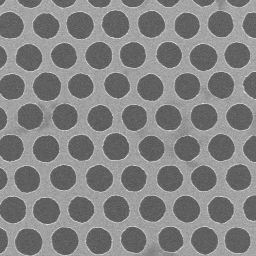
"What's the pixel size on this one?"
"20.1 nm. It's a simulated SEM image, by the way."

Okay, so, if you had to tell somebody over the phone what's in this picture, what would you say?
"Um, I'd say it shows a regular array of holes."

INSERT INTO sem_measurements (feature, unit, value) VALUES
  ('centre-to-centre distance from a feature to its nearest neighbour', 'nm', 687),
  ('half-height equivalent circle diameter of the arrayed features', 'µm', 0.536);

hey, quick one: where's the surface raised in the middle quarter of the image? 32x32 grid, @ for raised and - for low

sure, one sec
--@@@@-----@@@@----@@@@@@---@@@@
@@@@@@@@@@@@@@@@@@@@@@@@@@@@@@@@
@@@--@@@@@@----@@@@@@-@@@@@@@---
@@-----@@@------@@@-----@@@@----
@------@@@------@@-------@@@----
@-------@@-------@-------@@-----
@------@@@------@@-------@@@----
@@-----@@@@-----@@@------@@@----
@@@--@@@@@@@@-@@@@@-----@@@@@---
@@@@@@@@@@@@@@@@@@@@@@@@@@@@@@@@
--@@@@@@--@@@@@@---@@@@@---@@@@@
---@@@------@@@-----@@@------@@@
----@@------@@-------@@------@@@
----@@------@@-------@@-------@-
---@@@------@@@------@@------@@@
---@@@------@@@-----@@@@-----@@@
-@@@@@@@---@@@@@---@@@@@@---@@@@
@@@@@@@@@@@@--@@@@@@@@@@@@@@@@@@
@@----@@@@------@@@@----@@@@@---
@------@@@------@@@------@@@----
@-------@@------@@-------@@@----
@-------@@------@@@------@@-----
@------@@@------@@@------@@@----
@@-----@@@@----@@@@@----@@@@@---
@@@@@@@@@@@@@@@@@@@@@@@@@@@@@@-@
--@@@@@---@@@@@@--@@@@@@@---@@@@
---@@@-----@@@@-----@@@@-----@@@
---@@@------@@-------@@-------@@
---@@-------@@-------@@-------@@
---@@@------@@-------@@-------@@
--@@@@------@@@-----@@@@-----@@@
-@@@@@@----@@@@@---@@@@@@---@@@@